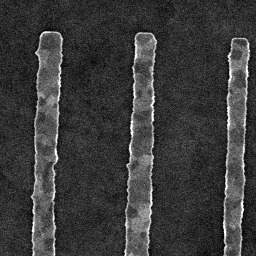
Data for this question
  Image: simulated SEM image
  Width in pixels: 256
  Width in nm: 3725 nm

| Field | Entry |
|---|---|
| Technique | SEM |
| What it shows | one or a few lines or trenches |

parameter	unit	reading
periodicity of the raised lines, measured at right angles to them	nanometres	1380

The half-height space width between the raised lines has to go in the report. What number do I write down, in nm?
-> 1070